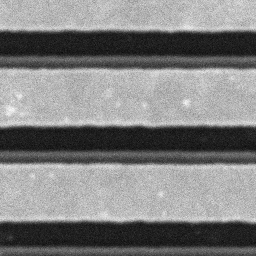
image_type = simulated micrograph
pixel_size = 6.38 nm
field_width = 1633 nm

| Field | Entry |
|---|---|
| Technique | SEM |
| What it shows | lines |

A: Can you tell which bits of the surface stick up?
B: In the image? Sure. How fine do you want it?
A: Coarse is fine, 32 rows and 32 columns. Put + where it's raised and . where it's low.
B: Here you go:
++++++++++++++++++++++++++++++++
++++++++++++++++++++++++++++++++
++++++++++++++++++++++++++++++++
++++++++++++++++++++++++++++++++
................................
................................
................................
................................
................................
++++++++++++++++++++++++++++++++
++++++++++++++++++++++++++++++++
++++++++++++++++++++++++++++++++
++++++++++++++++++++++++++++++++
++++++++++++++++++++++++++++++++
++++++++++++++++++++++++++++++++
++++++++++++++++++++++++++++++++
................................
................................
................................
................................
................................
++++++++++++++++++++++++++++++++
++++++++++++++++++++++++++++++++
++++++++++++++++++++++++++++++++
++++++++++++++++++++++++++++++++
++++++++++++++++++++++++++++++++
++++++++++++++++++++++++++++++++
+++++++++++++++++.++++++++++++++
................................
................................
................................
................................